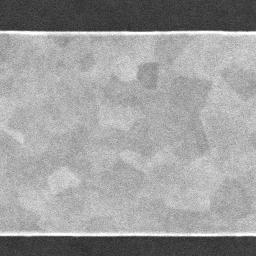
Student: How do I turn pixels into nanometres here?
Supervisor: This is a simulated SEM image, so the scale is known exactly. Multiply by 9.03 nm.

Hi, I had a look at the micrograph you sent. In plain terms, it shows wiring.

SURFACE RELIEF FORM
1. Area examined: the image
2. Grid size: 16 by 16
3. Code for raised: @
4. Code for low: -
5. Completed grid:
----------------
----------------
@@@@@@@@@@@@@@@@
@@@@@@@@@@@@@@@@
@@@@@@@@@@@@@@@@
@@@@@@@@@@@@@@@@
@@@@@@@@@@@@@@@@
@@@@@@@@@@@@@@@@
@@@@@@@@@@@@@@@@
@@@@@@@@@@@@@@@@
@@@@@@@@@@@@@@@@
@@@@@@@@@@@@@@@@
@@@@@@@@@@@@@@@@
@@@@@@@@@@@@@@@@
@@@@@@@@@@@@@@@@
----------------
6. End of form